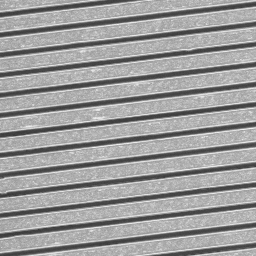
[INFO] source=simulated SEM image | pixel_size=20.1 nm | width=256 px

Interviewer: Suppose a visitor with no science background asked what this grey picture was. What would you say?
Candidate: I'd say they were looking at parallel lines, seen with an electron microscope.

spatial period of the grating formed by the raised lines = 0.401 micrometres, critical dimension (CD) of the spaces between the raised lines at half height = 110 nm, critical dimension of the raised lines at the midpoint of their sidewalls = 294 nanometers